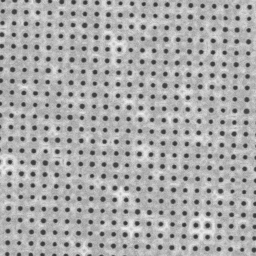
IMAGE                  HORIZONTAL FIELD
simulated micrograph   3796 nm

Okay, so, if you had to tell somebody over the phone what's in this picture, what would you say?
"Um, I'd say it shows a regular array of holes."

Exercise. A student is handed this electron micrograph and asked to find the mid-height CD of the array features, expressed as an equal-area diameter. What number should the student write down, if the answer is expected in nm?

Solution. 71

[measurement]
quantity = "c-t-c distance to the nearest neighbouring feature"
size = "169 nanometers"